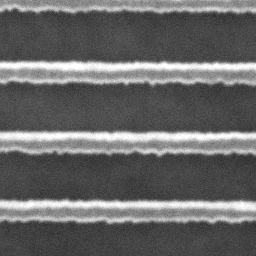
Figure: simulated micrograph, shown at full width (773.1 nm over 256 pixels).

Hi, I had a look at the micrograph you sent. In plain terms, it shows lines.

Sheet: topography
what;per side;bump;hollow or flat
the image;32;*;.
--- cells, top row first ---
********************************
................................
................................
................................
................................
................................
................................
................................
********************************
********************************
................................
................................
................................
................................
................................
................................
................................
********************************
********************************
................................
................................
................................
................................
................................
................................
*..**********...................
********************************
.**...******.************.*.**..
................................
................................
................................
................................